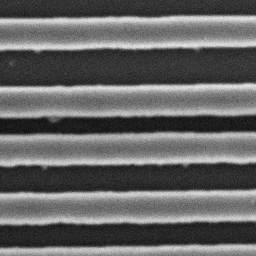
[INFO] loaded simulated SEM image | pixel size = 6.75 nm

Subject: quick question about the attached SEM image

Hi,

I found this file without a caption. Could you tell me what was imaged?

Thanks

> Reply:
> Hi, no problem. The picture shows lines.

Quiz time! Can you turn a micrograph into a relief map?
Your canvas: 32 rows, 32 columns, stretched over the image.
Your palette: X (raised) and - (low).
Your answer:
--------------------------------
--------------------------------
------XXXXXXXXXXXXXXXXXXXXXXXXXX
XXXXXXXXXXXXXXXXXXXXXXXXXXXXXXXX
XXXXXXXXXXXXXXXXXXXXXXXXXXXXXXXX
XXXXXXXXXXXXXXXXXXXXXXXXXXXXXXXX
--------------------------------
--------------------------------
--------------------------------
--------------------------------
--------------------------------
XXXXXXXXXXXXXXXXXXXXXXXXXXXXXXXX
XXXXXXXXXXXXXXXXXXXXXXXXXXXXXXXX
XXXXXXXXXXXXXXXXXXXXXXXXXXXXXXXX
XXXXX---------------------------
--------------------------------
--------------------------------
XXXXXXXXXXXXXXXXXXXXXXXXXXXXXXXX
XXXXXXXXXXXXXXXXXXXXXXXXXXXXXXXX
XXXXXXXXXXXXXXXXXXXXXXXXXXXXXXXX
XXXX-XXXX---X-------------------
--------------------------------
--------------------------------
--------------------------------
XXXXXXXXXXXXXXXXXXXXXXXXXXXXXXXX
XXXXXXXXXXXXXXXXXXXXXXXXXXXXXXXX
XXXXXXXXXXXXXXXXXXXXXXXXXXXXXXXX
XXXXXXXXXXXXXXXXXXXXXXXXXXXXXXXX
--------------------------------
--------------------------------
--------------------------------
XXXXXXXXXXXXXXXXXXXXXXXXXXXXXXXX